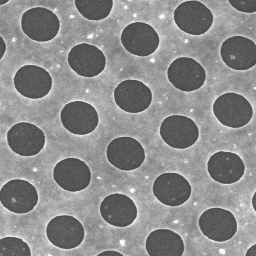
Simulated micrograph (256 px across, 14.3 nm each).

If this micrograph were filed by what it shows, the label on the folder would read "a regular array of holes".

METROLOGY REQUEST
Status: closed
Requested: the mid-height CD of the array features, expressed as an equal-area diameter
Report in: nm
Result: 515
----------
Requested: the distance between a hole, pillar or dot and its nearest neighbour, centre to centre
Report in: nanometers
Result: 820